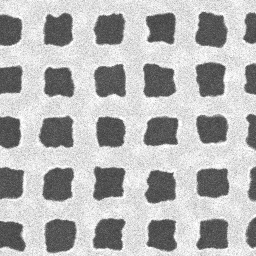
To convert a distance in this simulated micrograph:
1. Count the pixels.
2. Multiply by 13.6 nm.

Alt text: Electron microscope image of a regular array of holes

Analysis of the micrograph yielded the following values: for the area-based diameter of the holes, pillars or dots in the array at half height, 454 nm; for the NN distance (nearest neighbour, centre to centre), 682 nm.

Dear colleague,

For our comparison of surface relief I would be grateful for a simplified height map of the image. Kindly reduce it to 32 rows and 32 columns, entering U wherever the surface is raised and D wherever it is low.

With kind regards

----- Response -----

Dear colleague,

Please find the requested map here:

UUUUUUUUUUUUUUUUUUUUUUUUUUUUUUUU
UUUUUUUUUUUUUUUUUUUUUUUUUDUUUUUU
DDDUUUDDDUUUDDDDUUDDDDUUUDDDUUUD
DDDUUDDDDUUUDDDUUUDDDDUUUDDDUUUD
DDDUUUDDDUUUDDDUUUUDDDUUDDDDUUUD
DDUUUUDDDUUUDDDUUUUUUUUUUDDDUUUU
UUUUUUUUUUUUUUUUUUUUUUUUUUUUUUUU
UUUUUUUUUUUUUUUUUUUUUUUUUUUUUUUU
DDDUUUDUUUUUDDDDUUDDDUUUDDDDUUUD
DDDUUUDDDUUUDDDDUUDDDDUUUDDDUUUD
DDDUUUDDDUUUDDDDUUDDDDUUUDDDUUUD
DDUUUUDDDUUUDDDDUUDDDDUUUDDDUUUD
UUUUUUUUUUUUUUUUUUUUUUUUUUUUUUUU
UUUUUUUUUUUUUUUUUUUUUUUUUUUUUUUU
UUUUUUUUUUUUUUUUUUUUUUUUUDDDUUUD
DDUUUDDDDUUUDDDDUUDDDDUUUDDDUUUD
DDDUUDDDDUUUDDDDUUDDDDUUUDDDUUUD
DDUUUDDDDUUUDDDUUUDDDDUUUDDDUUUD
UUUUUUUUUUUUUUUUUUUUUUUUUUUUUUUD
UUUUUUUUUUUUUUUUUUUUUUUUUUUUUUUU
UUUUUUUUUUUUUUUUUUUUUUUUUUUUUUUU
DDDUUUDDDUUUDDDDUUUDDUUUUDDDUUUD
DDDUUDDDDUUUDDDDUUDDDDUUUDDDUUUD
DDDUUDDDDUUUDDDUUUDDDDUUUDDDDUUD
DDDUUDDDDUUUDDDUUUDDDDUUUDDDUUUD
UUUUUUUUUUUUUUUUUUUUUUUUUUUUUUUU
UUUUUUUUUUUUUUUUUUUUUUUUUUUUUUUU
UUUUUUUDDUUUUDDUUUUDDDUUUUDDUUUD
DDDUUUDDDDUUDDDUUUDDDDUUUDDDDUUD
DDDUUUDDDDUUDDDUUUDDDDUUUDDDDUUD
DDDUUUDDDUUUDDDUUUDDDDUUUDDDDUUD
UUUUUUDDUUUUUUUUUUUUUUUUUUUUUUUU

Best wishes